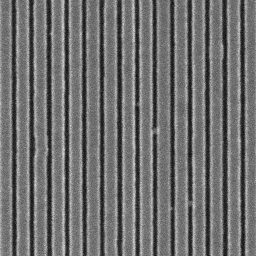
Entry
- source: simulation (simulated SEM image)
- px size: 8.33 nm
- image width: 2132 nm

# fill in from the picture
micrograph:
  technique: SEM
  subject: parallel lines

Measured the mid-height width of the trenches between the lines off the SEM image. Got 47.9 nanometres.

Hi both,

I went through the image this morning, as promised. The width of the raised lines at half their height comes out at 96.9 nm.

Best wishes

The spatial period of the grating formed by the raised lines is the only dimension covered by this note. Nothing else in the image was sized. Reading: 0.146 µm